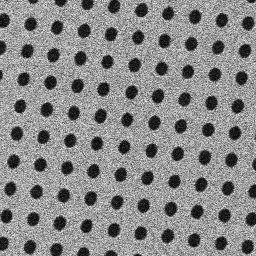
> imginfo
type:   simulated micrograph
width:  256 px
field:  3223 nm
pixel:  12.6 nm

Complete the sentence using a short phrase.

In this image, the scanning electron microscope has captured a regular array of holes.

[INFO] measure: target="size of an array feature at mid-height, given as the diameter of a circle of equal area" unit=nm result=171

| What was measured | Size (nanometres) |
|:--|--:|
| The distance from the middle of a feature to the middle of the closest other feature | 338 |